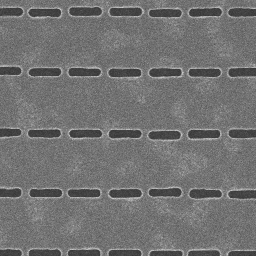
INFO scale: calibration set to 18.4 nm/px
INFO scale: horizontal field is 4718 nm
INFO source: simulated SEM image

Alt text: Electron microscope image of a regular array of holes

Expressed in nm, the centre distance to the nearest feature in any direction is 730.